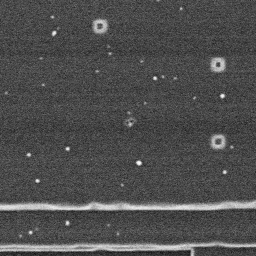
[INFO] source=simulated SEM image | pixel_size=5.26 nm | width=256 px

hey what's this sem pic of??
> wiring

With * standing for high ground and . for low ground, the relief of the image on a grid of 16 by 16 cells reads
****************
****************
****************
****************
****************
****************
****************
****************
****************
****************
****************
****************
****************
................
................
................